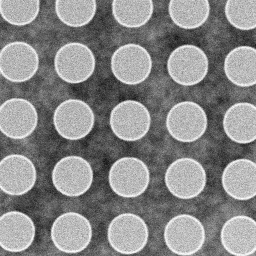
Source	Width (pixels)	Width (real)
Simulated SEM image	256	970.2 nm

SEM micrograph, an array of small figures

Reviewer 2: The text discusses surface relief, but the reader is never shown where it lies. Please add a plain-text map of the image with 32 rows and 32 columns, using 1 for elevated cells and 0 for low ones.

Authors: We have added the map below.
11111001111100111110011111001111
11111001111100111110011111001111
01110000111000011100001111000111
00000000000000000000000000000011
00000000000000000000000000000000
01100000010000000000000000000000
11110001111000011100001110000111
11111001111100111110011111001111
11111001111100111110011111001111
11110001111000111100011111001111
00000000000000000000000100000011
00000000000000000000000000000000
01100000000000000000000000000000
11110001111000111100001110000111
11111001111100111110011111001111
11110001111100111110011111001111
11110001111000111100011110001111
00000000000000001000001100000111
00000000000000000000000000000000
01100000000000000000000000000000
11110001111000111100001110000111
11110001111000111100011110001111
11110001111000111110011111001111
11110001111000111100011110001111
00000000000000011000001100000111
00000000000000000000000000000000
00000000000000000000000000000000
11110001111000111100011110000111
11110011111000111100011110001111
11110011111000111100011110001111
11110001111000111100011110001111
00000000110000011000001100000111